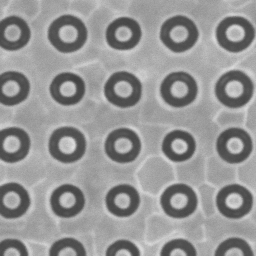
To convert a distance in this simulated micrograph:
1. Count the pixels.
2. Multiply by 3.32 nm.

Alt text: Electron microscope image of a regular array of ring-shaped grooves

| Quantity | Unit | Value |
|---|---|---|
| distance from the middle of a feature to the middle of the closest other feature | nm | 184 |